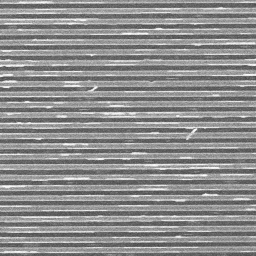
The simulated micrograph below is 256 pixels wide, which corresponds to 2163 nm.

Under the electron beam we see parallel lines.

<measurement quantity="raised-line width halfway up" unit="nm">46.4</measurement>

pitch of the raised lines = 10.4 px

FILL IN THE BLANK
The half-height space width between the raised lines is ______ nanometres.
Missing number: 39.1